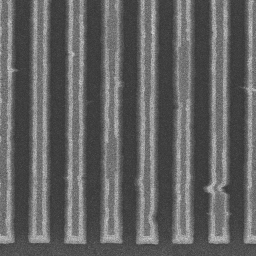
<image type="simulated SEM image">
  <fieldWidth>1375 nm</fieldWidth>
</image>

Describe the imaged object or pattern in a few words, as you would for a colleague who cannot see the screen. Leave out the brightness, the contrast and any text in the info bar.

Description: parallel lines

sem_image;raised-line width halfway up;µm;0.0959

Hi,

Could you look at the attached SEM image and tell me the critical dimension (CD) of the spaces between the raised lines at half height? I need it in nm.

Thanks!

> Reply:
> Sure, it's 95.9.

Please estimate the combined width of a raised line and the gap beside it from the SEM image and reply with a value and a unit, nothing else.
0.193 um